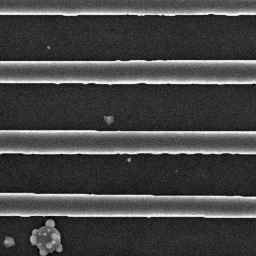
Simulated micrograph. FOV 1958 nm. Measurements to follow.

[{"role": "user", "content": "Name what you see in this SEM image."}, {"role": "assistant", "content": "lines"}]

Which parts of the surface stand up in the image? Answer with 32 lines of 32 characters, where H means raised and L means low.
HHHHHHHHHHHHHHHHHHHHHHHHHHHHHHHH
HHHHHHHHHHHHHHHHHHHHHHHHHHHHHHHH
LLLLLLLLLLLLLLLLLLLLLLLLLLLLLLLL
LLLLLLLLLLLLLLLLLLLLLLLLLLLLLLLL
LLLLLLLLLLLLLLLLLLLLLLLLLLLLLLLL
LLLLLLLLLLLLLLLLLLLLLLLLLLLLLLLL
LLLLLLLLLLLLLLLLLLLLLLLLLLLLLLLL
LLLLLLLLLLLLLLLLLLLLLLLLLLLLLLLL
HHHHHHHHHHHHHHHHHHHHHHHHHHHHHHHH
HHHHHHHHHHHHHHHHHHHHHHHHHHHHHHHH
LLLLLLLLLLLLLLLLLLLLLLLLLLLLLLLL
LLLLLLLLLLLLLLLLLLLLLLLLLLLLLLLL
LLLLLLLLLLLLLLLLLLLLLLLLLLLLLLLL
LLLLLLLLLLLLLLLLLLLLLLLLLLLLLLLL
LLLLLLLLLLLLLLLLLLLLLLLLLLLLLLLL
LLLLLLLLLLLLLLLLLLLLLLLLLLLLLLLL
HHHHHHHHHHHHHHHHHHHHHHHHHHHHHHHH
HHHHHHHHHHHHHHHHHHHHHHHHHHHHHHHH
HHHHHHHHHHHHHHHHHHHHHHHHHHHHHHHH
LLLLLLLLLLLLLLLLLLLLLLLLLLLLLLLL
LLLLLLLLLLLLLLLLLLLLLLLLLLLLLLLL
LLLLLLLLLLLLLLLLLLLLLLLLLLLLLLLL
LLLLLLLLLLLLLLLLLLLLLLLLLLLLLLLL
LLLLLLLLLLLLLLLLLLLLLLLLLLLLLLLL
HHHHHHHHHHHHHHHHHHHLLLLLLLLLLLLL
HHHHHHHHHHHHHHHHHHHHHHHHHHHHHHHH
HHHHHHHHHHHHHHHHHHHHHHHHHHHHHHHH
LLLLLLLLLLLLLLLLLLLLLLLLLLLLLLLL
LLLLLLLLLLLLLLLLLLLLLLLLLLLLLLLL
LLLLLLLLLLLLLLLLLLLLLLLLLLLLLLLL
LLLLLLLLLLLLLLLLLLLLLLLLLLLLLLLL
LLLLLLLLLLLLLLLLLLLLLLLLLLLLLLLL